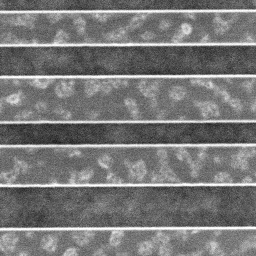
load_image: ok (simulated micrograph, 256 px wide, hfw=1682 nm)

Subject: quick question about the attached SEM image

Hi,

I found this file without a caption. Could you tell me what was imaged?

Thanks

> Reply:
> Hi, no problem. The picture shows one or a few lines or trenches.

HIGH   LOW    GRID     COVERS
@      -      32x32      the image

--------------------------------
-----@@@@@@@@@@@@@@@@@@@@@@@@@@@
@@@@@@@@@@@@@@@@@@@@@@@@@@@@@@@@
@@@@@@@@@@@@@@@@@@@@@@@@@@@@@@@@
@@@@@@@@@@@@@@@@@@@@@@@@@@@@@@@@
@@@@@@@@@@@@@@@@@@@@@@@@@@@@@@@@
--------------------------------
--------------------------------
--------------------------------
--------------------------------
@@@@@@@@@@@@@@@@@@@@@@@@@@@@@@@@
@@@@@@@@@@@@@@@@@@@@@@@@@@@@@@@@
@@@@@@@@@@@@@@@@@@@@@@@@@@@@@@@@
@@@@@@@@@@@@@@@@@@@@@@@@@@@@@@@@
@@@@@@@@@@@@@@@@@@@@@@@@@@@@@@@@
--------------------------------
--------------------------------
--------------------------------
@@@@@@@@@@@@@@@@@@@@@@@@@@@@@@@@
@@@@@@@@@@@@@@@@@@@@@@@@@@@@@@@@
@@@@@@@@@@@@@@@@@@@@@@@@@@@@@@@@
@@@@@@@@@@@@@@@@@@@@@@@@@@@@@@@@
@@@@@@@@@@@@@@@@@@@@@@@@@@@@@@@@
--------------------------------
--------------------------------
--------------------------------
--------------------------------
--------------------------------
--------------------------------
@@@@@@@@@@@@@@@@@@@@@@@@@@@@@@@@
@@@@@@@@@@@@@@@@@@@@@@@@@@@@@@@@
@@@@@@@@@@@@@@@@@@@@@@@@@@@@@@@@